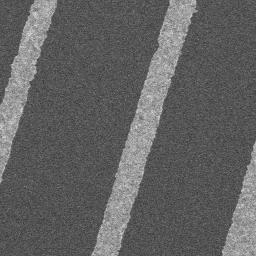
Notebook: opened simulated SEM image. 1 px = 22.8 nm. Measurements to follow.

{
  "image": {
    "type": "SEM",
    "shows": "one or a few lines or trenches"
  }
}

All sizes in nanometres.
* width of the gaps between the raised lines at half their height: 2470